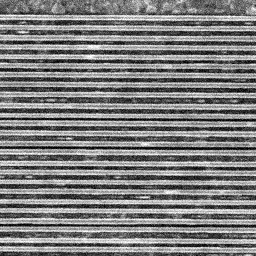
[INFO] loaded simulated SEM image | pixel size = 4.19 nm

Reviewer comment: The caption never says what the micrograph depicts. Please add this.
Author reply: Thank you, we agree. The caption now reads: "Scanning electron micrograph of parallel lines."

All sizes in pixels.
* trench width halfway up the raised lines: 5.37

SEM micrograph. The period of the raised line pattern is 40.5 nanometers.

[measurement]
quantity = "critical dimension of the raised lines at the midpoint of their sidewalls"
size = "4.51 px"